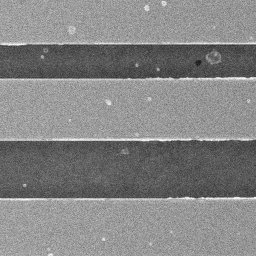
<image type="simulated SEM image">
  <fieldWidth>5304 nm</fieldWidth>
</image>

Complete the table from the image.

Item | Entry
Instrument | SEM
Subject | lines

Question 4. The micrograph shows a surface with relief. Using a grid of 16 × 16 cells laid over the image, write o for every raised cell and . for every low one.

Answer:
oooooooooooooooo
oooooooooooooooo
oooooooooooooooo
................
................
oooooooooooooooo
oooooooooooooooo
oooooooooooooooo
oooooooooooooooo
................
................
................
oooooooooooooooo
oooooooooooooooo
oooooooooooooooo
oooooooooooooooo